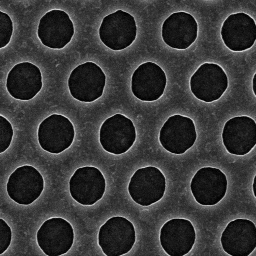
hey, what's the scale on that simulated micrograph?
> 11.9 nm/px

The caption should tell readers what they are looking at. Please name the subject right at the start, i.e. a regular array of holes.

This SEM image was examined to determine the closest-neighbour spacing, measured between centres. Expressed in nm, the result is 710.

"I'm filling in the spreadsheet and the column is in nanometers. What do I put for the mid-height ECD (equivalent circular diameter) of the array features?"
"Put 449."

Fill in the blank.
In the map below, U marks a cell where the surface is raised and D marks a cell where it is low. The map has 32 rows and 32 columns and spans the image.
UUUUUUUUUUUUUUUUUUUUUUUUUUUUUUUU
UUUUUUDDUUUUUUDDUUUUUUDUUUUUUUUU
DUUUUDDDDUUUUDDDDUUUUDDDUUUUDDDD
DDUUUDDDDUUUDDDDDUUUDDDDDUUUDDDD
DUUUUDDDDUUUDDDDDUUUDDDDDUUUDDDD
DUUUUDDDUUUUUDDDUUUUUDDDUUUUDDDD
UUUUUUUUUUUUUUUUUUUUUUUUUUUUUUUU
UUUUUUUUUUUUUUUUUUUUUUUUUUUUUUUU
UUDDDUUUUDDDDUUUUDDDUUUUUDDDUUUU
UDDDDUUUUDDDDUUUUDDDDUUUDDDDUUUU
UDDDDUUUUDDDDUUUDDDDDUUUDDDDUUUU
UDDDDUUUUDDDDUUUUDDDUUUUDDDDUUUU
UUUUUUUUUUDDUUUUUUDUUUUUUDDUUUUU
UUUUUUUUUUUUUUUUUUUUUUUUUUUUUUUU
UUUUUUDDUUUUUUDDUUUUUDDUUUUUUUUU
DUUUUDDDDUUUUDDDDUUUUDDDUUUUDDDD
DDUUUDDDDUUUDDDDDUUUDDDDDUUUDDDD
DUUUUDDDDUUUDDDDDUUUDDDDUUUUDDDD
DUUUUDDDUUUUUDDDUUUUUDDDUUUUDDDD
UUUUUUUUUUUUUUUUUUUUUUUUUUUUUUUU
UUUUUUUUUUUUUUUUUUUUUUUUUUUUUUUU
UUDDDUUUUDDDDUUUUDDDUUUUUDDDUUUU
UDDDDUUUUDDDDUUUDDDDDUUUDDDDUUUU
UDDDDUUUUDDDDUUUDDDDDUUUDDDDUUUU
UDDDDUUUUDDDDUUUDDDDUUUUDDDDUUUU
UUUDUUUUUUDDUUUUUDDUUUUUUDDUUUUU
UUUUUUUUUUUUUUUUUUUUUUUUUUUUUUUU
UUUUUUDDUUUUUUDDUUUUUDDUUUUUUDDU
DUUUUDDDDUUUUDDDDUUUDDDDUUUUDDDD
DUUUUDDDDUUUDDDDDUUUDDDDUUUUDDDD
DUUUUDDDDUUUDDDDDUUUDDDDUUUUDDDD
UUUUUDDDUUUUUDDDUUUUUDDDUUUUDDDU